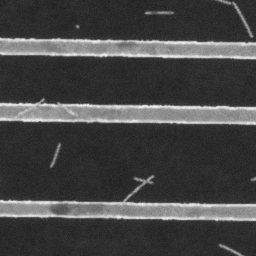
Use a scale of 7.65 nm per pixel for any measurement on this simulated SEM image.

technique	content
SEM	lines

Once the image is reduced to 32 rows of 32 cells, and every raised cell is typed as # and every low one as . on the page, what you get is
................................
................................
................................
................................
................................
################################
################################
................................
................................
................................
................................
................................
................................
################################
################################
...............................#
................................
................................
................................
................................
................................
................................
................................
................................
................................
#######################.........
################################
.............................###
................................
................................
................................
................................